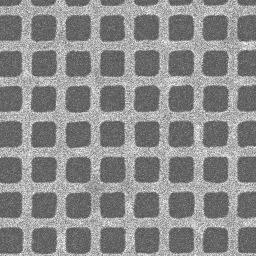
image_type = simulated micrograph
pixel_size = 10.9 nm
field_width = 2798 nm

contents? a regular array of holes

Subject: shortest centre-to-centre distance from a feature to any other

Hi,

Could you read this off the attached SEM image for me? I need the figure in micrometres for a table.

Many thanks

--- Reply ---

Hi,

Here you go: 0.374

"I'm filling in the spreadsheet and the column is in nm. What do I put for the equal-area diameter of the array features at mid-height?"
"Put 311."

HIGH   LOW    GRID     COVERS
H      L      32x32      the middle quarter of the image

LLLLLLLHHLLLLLLHHLLLLLLLHHLLLLLL
LLLLLLLHHLLLLLLHHLLLLLLLHHLLLLLL
LLLLLLHHHLLLLLLHHHLLLLLHHHLLLLLL
HHHHHHHHHHHHHHHHHHHHHHHHHHHHHHHH
HHHHHHHHHHHHHHHHHHHHHHHHHHHHHHHH
HHLLLLHHHHLLLLLHHHHLLLLHHHHLLLLL
LLLLLLLHHLLLLLLHHHLLLLLLHHLLLLLL
LLLLLLLHHLLLLLLHHHLLLLLLHHLLLLLL
LLLLLLLHHLLLLLLHHHLLLLLLHHLLLLLL
LLLLLLLHHLLLLLLHHLLLLLLLHHLLLLLL
LLLLLLLHHLLLLLLHHLLLLLLLHHLLLLLL
HLLLLLHHHLLLLLLHHHLLLLLHHHLLLLLL
HHHHHHHHHHHHHHHHHHHHHHHHHHHHHHHH
HHHHHHHHHHHHHHHHHHHHHHHHHHHHHHHH
HHLLLLHHHHLLLLLHHHHLLLLHHHHLLLLL
LLLLLLLHHLLLLLLHHHLLLLLLHHLLLLLL
LLLLLLLHHLLLLLLHHLLLLLLLHHLLLLLL
LLLLLLLHHLLLLLLHHLLLLLLLHHLLLLLL
LLLLLLLHHLLLLLLHHLLLLLLLHHLLLLLL
LLLLLLLHHLLLLLLHHHLLLLLLHHLLLLLL
HLLLLLHHHLLLLLHHHHLLLLLHHHLLLLLL
HHHHHHHHHHHHHHHHHHHHHHHHHHHHHHHH
HHHHHHHHHHHHHHHHHHHHHHHHHHHHHHHH
HLLLLLHHHHLLLLLHHHLLLLLLHHHLLLLL
LLLLLLLHHLLLLLLHHLLLLLLLHHLLLLLL
LLLLLLLHHLLLLLLHHHLLLLLLHHLLLLLL
LLLLLLLHHLLLLLLHHHLLLLLLHHLLLLLL
LLLLLLLHHLLLLLLHHHLLLLLLHHLLLLLL
LLLLLLLHHLLLLLLHHHLLLLLLHHLLLLLL
HLLLLLHHHHLLLLHHHHLLLLLHHHHLLLLL
HHHHHHHHHHHHHHHHHHHHHHHHHHHHHHHH
HHHHHHHHHHHHHHHHHHHHHHHHHHHHHHHH